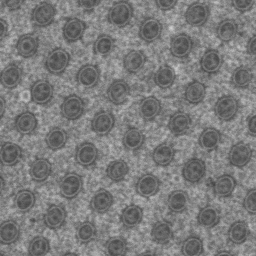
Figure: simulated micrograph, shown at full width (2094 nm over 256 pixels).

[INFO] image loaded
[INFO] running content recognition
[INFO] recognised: a regular array of raised bodies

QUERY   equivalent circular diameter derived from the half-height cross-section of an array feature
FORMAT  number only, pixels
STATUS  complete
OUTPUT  17.9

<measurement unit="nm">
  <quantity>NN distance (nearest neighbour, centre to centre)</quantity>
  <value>279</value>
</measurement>